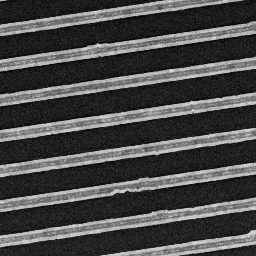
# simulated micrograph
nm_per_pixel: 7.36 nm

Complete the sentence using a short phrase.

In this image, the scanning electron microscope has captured parallel lines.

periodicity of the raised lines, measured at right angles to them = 256 nm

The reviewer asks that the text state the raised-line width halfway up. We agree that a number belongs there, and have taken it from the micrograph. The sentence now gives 68.2 nm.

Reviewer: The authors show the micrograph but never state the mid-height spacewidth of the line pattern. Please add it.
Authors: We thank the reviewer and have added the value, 191 nanometres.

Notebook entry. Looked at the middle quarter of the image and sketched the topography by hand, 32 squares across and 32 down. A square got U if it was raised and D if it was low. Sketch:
DDDDDDDDDDDDDDDDDDDDDDDDDDDDDDDD
DDDDDDDDDDDDDDDDDDDDDDDDDDDDDUUU
DDDDDDDDDDDDDDDDDDDDDDUUUUUUUUUU
DDDDDDDDDDDDDDDUUUUUUUUUUUUUUUDD
DDDDDDDDUUUUUUUUUUUUUUUDDDDDDDDD
DDUUUUUUUUUUUUUUUDDDDDDDDDDDDDDD
UUUUUUUUUUDDDDDDDDDDDDDDDDDDDDDD
UUUDDDDDDDDDDDDDDDDDDDDDDDDDDDDD
DDDDDDDDDDDDDDDDDDDDDDDDDDDDDDDD
DDDDDDDDDDDDDDDDDDDDDDDDDDDDDDDD
DDDDDDDDDDDDDDDDDDDDDDDDDDDDUUUU
DDDDDDDDDDDDDDDDDDDDDUUUUUUUUUUU
DDDDDDDDDDDDDDDUUUUUUUUUUUUUUDDD
DDDDDDDDUUUUUUUUUUUUUUDDDDDDDDDD
DUUUUUUUUUUUUUUUDDDDDDDDDDDDDDDD
UUUUUUUUDDDDDDDDDDDDDDDDDDDDDDDD
UUDDDDDDDDDDDDDDDDDDDDDDDDDDDDDD
DDDDDDDDDDDDDDDDDDDDDDDDDDDDDDDD
DDDDDDDDDDDDDDDDDDDDDDDDDDDDDDDD
DDDDDDDDDDDDDDDDDDDDDDDDDDUUUUUU
DDDDDDDDDDDDDDDDDDDUUUUUUUUUUUUU
DDDDDDDDDDDDUUUUUUUUUUUUUUUDDDDD
DDDDDDUUUUUUUUUUUUUUDDDDDDDDDDDD
UUUUUUUUUUUUUUDDDDDDDDDDDDDDDDDD
UUUUUUUDDDDDDDDDDDDDDDDDDDDDDDDD
DDDDDDDDDDDDDDDDDDDDDDDDDDDDDDDD
DDDDDDDDDDDDDDDDDDDDDDDDDDDDDDDD
DDDDDDDDDDDDDDDDDDDDDDDDDDDDDDDU
DDDDDDDDDDDDDDDDDDDDDDDDDUUUUUUU
DDDDDDDDDDDDDDDDDDUUUUUUUUUUUUUU
DDDDDDDDDDUUUUUUUUUUUUUUUDDDDDDD
DDDUUUUUUUUUUUUDDDDDDDDDDDDDDDDD